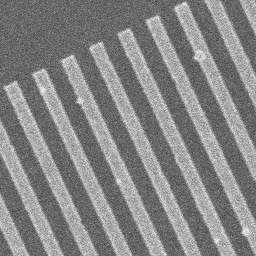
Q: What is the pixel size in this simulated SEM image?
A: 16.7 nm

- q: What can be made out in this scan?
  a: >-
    parallel lines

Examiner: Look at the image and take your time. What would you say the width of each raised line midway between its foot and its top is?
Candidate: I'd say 211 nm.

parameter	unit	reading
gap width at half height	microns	0.317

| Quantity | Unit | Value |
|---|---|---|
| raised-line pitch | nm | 520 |